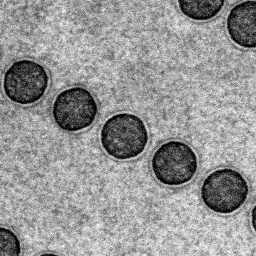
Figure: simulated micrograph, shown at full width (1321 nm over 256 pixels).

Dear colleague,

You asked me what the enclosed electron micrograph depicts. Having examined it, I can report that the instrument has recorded holes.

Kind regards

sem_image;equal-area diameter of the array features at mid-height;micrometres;0.235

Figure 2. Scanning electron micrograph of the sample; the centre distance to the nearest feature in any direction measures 291 nanometers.